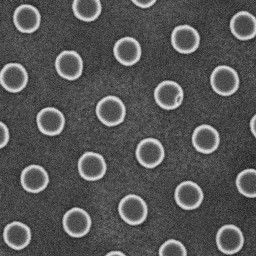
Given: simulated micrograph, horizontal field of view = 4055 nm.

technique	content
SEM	a regular array of raised bodies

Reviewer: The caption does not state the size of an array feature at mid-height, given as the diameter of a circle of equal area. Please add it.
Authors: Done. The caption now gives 428 nm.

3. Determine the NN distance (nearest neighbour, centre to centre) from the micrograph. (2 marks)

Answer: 913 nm